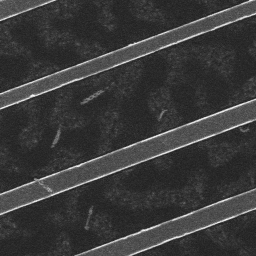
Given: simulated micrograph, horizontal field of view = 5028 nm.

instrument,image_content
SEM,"one or a few lines or trenches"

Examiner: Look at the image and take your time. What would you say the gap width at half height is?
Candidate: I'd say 72.9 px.